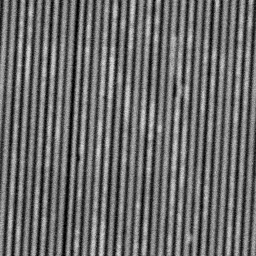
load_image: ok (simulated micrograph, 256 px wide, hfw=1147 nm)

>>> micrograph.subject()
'parallel lines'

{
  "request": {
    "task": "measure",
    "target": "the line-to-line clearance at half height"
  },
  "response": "17.3 nanometres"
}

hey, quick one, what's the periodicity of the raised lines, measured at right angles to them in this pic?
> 0.0378 microns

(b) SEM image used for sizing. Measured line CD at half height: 21.8 nm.